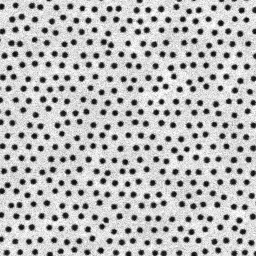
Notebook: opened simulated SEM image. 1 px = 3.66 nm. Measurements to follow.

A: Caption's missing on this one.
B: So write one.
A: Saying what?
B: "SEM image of a regular array of holes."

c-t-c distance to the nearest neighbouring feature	40.8	nm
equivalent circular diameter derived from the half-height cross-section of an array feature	21.1	nm